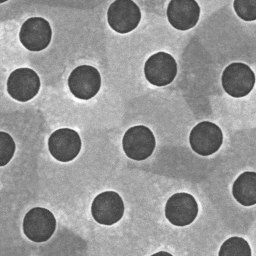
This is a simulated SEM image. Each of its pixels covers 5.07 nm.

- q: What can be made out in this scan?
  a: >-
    a regular array of holes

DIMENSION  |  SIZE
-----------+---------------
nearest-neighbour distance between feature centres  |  342 nanometers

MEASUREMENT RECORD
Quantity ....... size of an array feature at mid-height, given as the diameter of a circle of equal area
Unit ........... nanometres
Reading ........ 176